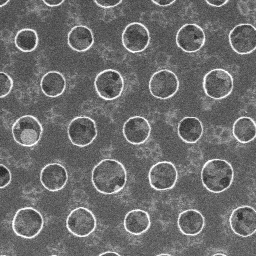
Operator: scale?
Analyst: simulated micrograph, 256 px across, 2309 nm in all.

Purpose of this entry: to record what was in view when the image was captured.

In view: a regular array of raised bodies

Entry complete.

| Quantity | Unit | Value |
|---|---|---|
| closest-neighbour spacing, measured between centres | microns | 0.476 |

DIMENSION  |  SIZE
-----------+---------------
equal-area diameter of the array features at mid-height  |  252 nanometres